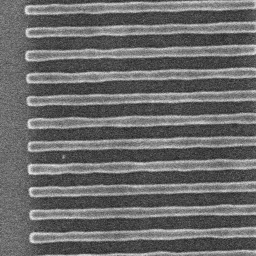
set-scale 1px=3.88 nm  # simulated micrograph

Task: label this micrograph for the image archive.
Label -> groups of lines, slits or small figures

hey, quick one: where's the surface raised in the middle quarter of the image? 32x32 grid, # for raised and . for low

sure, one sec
................................
................................
################################
################################
................................
................................
................................
..........................######
################################
####################......##....
................................
................................
................................
.............###################
################################
########......###...............
................................
................................
............................####
################################
################################
................................
................................
................................
......................##########
################################
##########################..####
................................
................................
................................
............#####..#############
################################